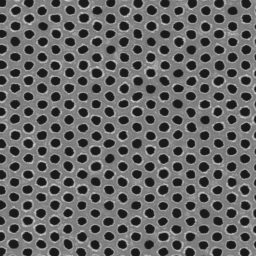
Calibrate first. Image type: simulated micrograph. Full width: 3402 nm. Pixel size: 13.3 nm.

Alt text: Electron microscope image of a regular array of holes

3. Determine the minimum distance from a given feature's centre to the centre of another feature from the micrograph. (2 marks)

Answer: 202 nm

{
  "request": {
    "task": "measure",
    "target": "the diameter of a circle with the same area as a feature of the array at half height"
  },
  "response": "123 nanometers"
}